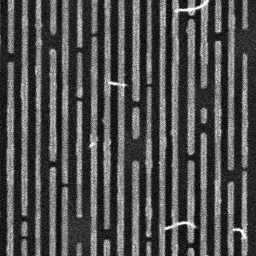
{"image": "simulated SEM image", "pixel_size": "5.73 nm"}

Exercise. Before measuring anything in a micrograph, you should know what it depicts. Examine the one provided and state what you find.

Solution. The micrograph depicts parallel lines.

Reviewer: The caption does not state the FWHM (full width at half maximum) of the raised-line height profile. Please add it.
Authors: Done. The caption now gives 32.3 nm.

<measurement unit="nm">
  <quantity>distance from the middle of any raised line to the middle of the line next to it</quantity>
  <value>79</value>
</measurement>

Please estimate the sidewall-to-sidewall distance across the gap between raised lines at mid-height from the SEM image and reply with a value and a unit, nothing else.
0.048 micrometres